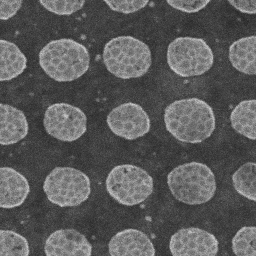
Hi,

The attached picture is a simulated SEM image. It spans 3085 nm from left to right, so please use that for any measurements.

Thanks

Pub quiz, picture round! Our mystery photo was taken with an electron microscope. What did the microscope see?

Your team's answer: a regular array of raised bodies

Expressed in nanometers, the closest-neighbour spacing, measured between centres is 758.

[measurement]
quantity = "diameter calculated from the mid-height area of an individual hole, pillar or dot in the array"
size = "39.9 px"